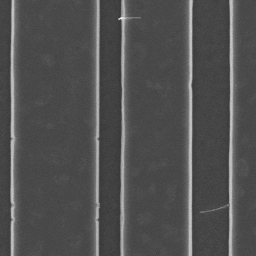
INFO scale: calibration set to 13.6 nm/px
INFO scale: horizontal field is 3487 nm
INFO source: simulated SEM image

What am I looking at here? one or a few lines or trenches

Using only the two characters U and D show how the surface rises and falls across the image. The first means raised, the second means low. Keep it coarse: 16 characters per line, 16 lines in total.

DUUUUUDDUUUUDDUU
DUUUUUDDUUUUDDUU
DUUUUUDDUUUUDDUU
DUUUUUDDUUUUDDUU
DUUUUUDDUUUUDDUU
DUUUUUDDUUUUDDUU
DUUUUUDDUUUUDDUU
DUUUUUDDUUUUDDUU
DUUUUUDDUUUUDDUU
DUUUUUDDUUUUDDUU
DUUUUUDDUUUUDDUU
DUUUUUDDUUUUDDUU
DUUUUUDDUUUUDDUU
DUUUUUDDUUUUDDUU
DUUUUUDDUUUUDDUU
DUUUUUDDUUUUDDUU